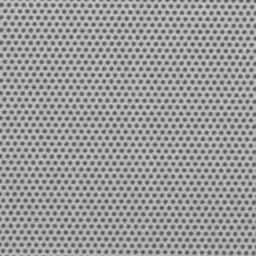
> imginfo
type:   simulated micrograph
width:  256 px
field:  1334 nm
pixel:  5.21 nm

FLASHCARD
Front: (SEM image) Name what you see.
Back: a regular array of holes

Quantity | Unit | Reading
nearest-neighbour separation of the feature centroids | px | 7.04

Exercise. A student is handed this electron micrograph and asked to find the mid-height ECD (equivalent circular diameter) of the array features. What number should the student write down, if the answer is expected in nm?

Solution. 24.2